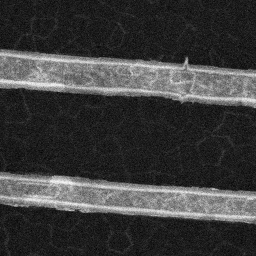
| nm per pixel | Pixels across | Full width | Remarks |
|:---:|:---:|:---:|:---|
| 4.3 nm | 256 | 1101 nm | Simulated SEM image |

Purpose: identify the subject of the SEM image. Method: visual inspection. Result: one or a few lines or trenches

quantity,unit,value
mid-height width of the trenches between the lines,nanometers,415